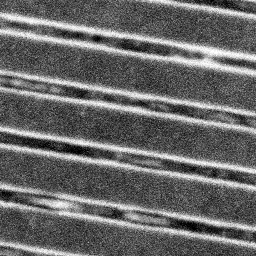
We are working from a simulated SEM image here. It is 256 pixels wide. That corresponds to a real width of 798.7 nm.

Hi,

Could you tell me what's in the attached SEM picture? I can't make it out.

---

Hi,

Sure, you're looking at parallel lines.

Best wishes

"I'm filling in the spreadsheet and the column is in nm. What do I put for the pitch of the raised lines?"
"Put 176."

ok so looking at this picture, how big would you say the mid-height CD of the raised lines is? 133 nm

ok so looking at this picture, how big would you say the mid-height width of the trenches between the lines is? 45.1 nm